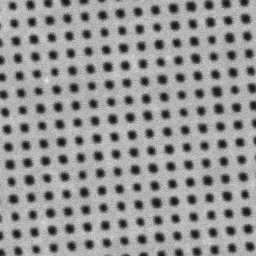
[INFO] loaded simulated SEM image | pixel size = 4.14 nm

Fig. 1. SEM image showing a regular array of holes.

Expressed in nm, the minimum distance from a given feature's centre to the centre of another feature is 71.6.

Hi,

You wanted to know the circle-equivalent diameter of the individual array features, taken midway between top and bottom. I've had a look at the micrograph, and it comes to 41.5 nanometres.